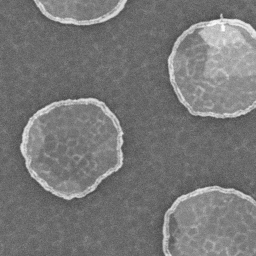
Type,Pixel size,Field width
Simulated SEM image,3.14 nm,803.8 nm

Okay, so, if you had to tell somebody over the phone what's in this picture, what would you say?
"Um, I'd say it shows raised bodies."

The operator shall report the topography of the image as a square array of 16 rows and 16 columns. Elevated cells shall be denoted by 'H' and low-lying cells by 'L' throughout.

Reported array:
LLHHHHHHLLLLLLLL
LLLLLHLLLLLLHHHL
LLLLLLLLLLLHHHHH
LLLLLLLLLLLHHHHH
LLLLLLLLLLLHHHHH
LLLLLLLLLLLHHHHH
LLLHHHLLLLLHHHHH
LLHHHHHLLLLLLLLL
LHHHHHHHLLLLLLLL
LHHHHHHHLLLLLLLL
LLHHHHHLLLLLLLLL
LLLHHHLLLLLLLLLL
LLLLLLLLLLLHHHHH
LLLLLLLLLLHHHHHH
LLLLLLLLLLHHHHHH
LLLLLLLLLLHHHHHH